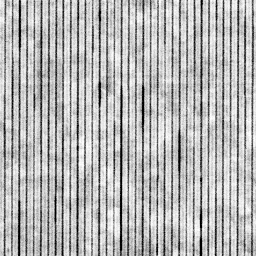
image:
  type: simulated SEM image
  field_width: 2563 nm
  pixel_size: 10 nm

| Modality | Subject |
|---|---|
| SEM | parallel lines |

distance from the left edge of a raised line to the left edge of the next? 7.27 pixels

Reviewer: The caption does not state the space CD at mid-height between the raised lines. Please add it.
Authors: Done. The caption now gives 30 nanometers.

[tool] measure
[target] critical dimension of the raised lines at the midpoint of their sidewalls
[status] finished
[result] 4 pixels